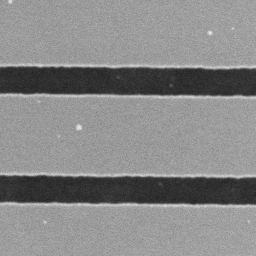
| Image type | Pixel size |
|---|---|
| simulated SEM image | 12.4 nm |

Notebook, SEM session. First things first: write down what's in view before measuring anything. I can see lines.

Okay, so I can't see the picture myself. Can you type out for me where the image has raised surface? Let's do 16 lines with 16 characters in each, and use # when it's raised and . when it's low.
################
################
################
################
................
................
################
################
################
################
################
................
................
################
################
################